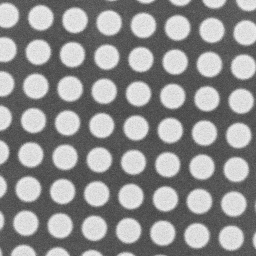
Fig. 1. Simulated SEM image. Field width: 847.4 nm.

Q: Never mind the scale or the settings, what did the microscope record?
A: an array of small figures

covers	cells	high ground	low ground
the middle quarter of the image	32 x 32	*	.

.**......****....*****...******.
..................***....*****..
...........................*....
***.............................
****....****......*.............
****...******...*****.....***...
*****..******...*****....*****..
****...******...******..******..
****....****....******..******..
.........**.....*****...******..
.........................****...
................................
***......*......................
****...*****....****............
****..******...******...*****...
****..******...******...*****...
***....*****...******...*****...
**.....*****...******...*****...
.................***....*****...
.........................**.....
*...............................
***....****.....................
***...*****....****......**.....
***...******...*****...*****....
***...******..******...******...
**....*****....*****...******...
.......***.....*****...******...
........................****....
................................
**..............................
**....****.....***..............
***..******...*****....****.....